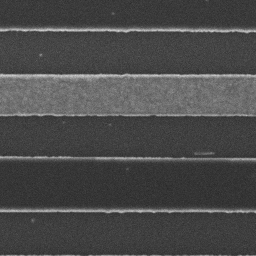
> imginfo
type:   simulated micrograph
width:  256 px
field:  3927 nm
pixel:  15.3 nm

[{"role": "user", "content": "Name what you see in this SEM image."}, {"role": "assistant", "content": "lines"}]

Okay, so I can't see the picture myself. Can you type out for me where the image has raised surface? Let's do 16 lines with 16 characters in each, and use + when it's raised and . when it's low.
++++++++++++++++
++++++++++++++++
................
................
................
++++++++++++++++
++++++++++++++++
................
................
................
++++++++++++++++
++++++++++++++++
++++++++++++++++
................
................
................